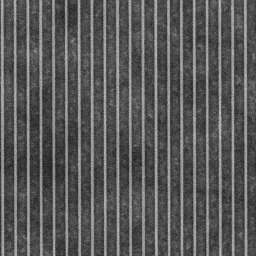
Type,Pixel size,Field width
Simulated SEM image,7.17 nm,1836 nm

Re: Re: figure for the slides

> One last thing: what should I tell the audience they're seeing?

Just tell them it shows parallel lines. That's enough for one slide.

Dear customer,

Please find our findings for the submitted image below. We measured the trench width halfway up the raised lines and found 78.9 nm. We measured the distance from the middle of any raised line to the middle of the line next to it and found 12.8 px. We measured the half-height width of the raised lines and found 13.4 nanometres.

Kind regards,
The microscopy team